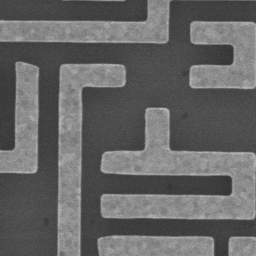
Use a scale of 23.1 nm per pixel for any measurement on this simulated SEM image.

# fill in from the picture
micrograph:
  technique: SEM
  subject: wiring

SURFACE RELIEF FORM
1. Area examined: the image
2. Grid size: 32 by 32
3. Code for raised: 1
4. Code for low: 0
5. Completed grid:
00000000000000000001100000000000
00000000000000000001100000000000
00000000000000000011100000000000
11111111111111111111100011111111
11111111111111111111100011111111
00000000000000000000000000001111
00000000000000000000000000000111
00000000000000000000000000000111
00111000111111110000000011111111
00111000111111110000000011111111
00111000111111110000000011111111
00111001110000000000000000000000
00111001110000000000000000000000
00111001110000000000000000000000
00111001110000000011100000000000
00111001110000000011100000000000
00111001110000000011100000000000
00111001110000000011100000000000
00111001110000000011100000000000
11111001110001111111111111111111
11111001110001111111111111111111
00110001110001111111111111111111
00000001110000000000000000000111
00000001110000000000000000000111
00000001110001111111111111111111
00000001110001111111111111111111
00000001110001111111111111111111
00000001110000000000000000000000
00000001110000000000000000000000
00000001110000111100000000000000
00000001110011111111111111100111
00000001110011111111111111100111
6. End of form